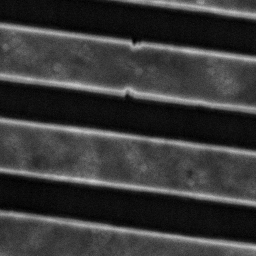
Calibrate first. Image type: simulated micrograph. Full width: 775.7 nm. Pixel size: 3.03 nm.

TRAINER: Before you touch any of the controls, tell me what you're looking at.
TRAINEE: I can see one or a few lines or trenches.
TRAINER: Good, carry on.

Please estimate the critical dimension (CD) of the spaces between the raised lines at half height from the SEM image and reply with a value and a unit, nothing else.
0.124 µm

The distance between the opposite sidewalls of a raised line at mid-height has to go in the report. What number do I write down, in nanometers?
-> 159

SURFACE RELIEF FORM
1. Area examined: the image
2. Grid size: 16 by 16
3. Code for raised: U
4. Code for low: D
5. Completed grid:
DDDDDDDDDDDDUUUU
DDDDDDDDDDDDDDDD
UUUUUUUDDDDDDDDD
UUUUUUUUUUUUUUUD
UUUUUUUUUUUUUUUU
DDDDDUUUUUUUUUUU
DDDDDDDDDDDDUUUU
UDDDDDDDDDDDDDDD
UUUUUUUUDDDDDDDD
UUUUUUUUUUUUUUUU
UUUUUUUUUUUUUUUU
DDDDDDUUUUUUUUUU
DDDDDDDDDDDDDDUU
UUDDDDDDDDDDDDDD
UUUUUUUUUDDDDDDD
UUUUUUUUUUUUUUUU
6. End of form